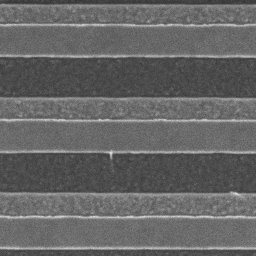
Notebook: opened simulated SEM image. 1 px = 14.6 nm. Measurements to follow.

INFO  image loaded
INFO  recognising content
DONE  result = lines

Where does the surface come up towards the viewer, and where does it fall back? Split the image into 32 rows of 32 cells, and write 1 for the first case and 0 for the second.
00000000000000000000000000000000
11111111111111111111111111111111
11111111111111111111111111111111
11111111111111111111111111111111
11111111111111111111111111111111
11111111111111111111111111111111
11111111111111111111111111111111
00000000000000000000000000000000
00000000000000000000000000000000
00000000000000000000000000000000
00000000000000000000000000000000
00000000000000000000000000000000
11111111111111111111111111111111
11111111111111111111111111111111
11111111111111111111111111111111
11111111111111111111111111111111
11111111111111111111111111111111
11111111111111111111111111111111
11111111111111111111111111111111
00000000000000000000000000000000
00000000000000000000000000000000
00000000000000000000000000000000
00000000000000000000000000000000
00000000000000000000000000000000
11111111111111111111111111111111
11111111111111111111111111111111
11111111111111111111111111111111
11111111111111111111111111111111
11111111111111111111111111111111
11111111111111111111111111111111
11111111111111111111111111111111
00000000000000000000000000000000